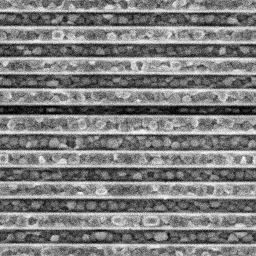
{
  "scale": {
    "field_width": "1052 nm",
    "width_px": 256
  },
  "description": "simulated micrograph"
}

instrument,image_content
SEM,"parallel lines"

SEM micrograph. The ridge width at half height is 65.8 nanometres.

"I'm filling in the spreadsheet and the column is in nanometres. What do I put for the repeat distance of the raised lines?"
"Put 128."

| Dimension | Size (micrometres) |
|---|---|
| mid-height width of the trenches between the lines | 0.0617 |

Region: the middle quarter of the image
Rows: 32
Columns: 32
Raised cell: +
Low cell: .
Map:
++++++++++++++++++++++++++++++++
++++++++++++++++++++++++++++++++
................................
................................
................................
................................
++++++++++++++++++++++++++++++++
++++++++++++++++++++++++++++++++
++++++++++++++++++++++++++++++++
++++++++++++++++++++++++++++++++
................................
................................
................................
++++++++++++++++++++++++++++++++
++++++++++++++++++++++++++++++++
++++++++++++++++++++++++++++++++
++++++++++++++++++++++++++++++++
................................
................................
................................
................................
................................
++++++++++++++++++++++++++++++++
++++++++++++++++++++++++++++++++
++++++++++++++++++++++++++++++++
++++++++++++++++++++++++++++++++
................................
................................
................................
................................
++++++++++++++++++++++++++++++++
++++++++++++++++++++++++++++++++